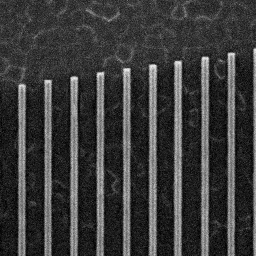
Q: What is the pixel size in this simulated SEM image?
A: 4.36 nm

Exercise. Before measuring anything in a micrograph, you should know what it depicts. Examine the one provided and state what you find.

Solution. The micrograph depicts parallel lines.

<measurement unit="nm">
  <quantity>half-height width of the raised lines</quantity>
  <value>25.6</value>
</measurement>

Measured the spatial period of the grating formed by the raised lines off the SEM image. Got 114 nanometres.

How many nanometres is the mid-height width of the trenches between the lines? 89.4